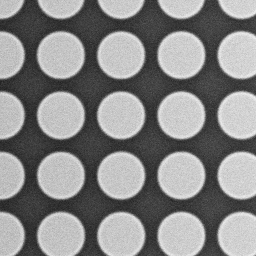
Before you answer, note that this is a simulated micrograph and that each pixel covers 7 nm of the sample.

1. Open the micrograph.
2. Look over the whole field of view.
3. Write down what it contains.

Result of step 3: an array of small figures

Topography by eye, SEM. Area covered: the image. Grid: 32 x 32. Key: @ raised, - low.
@@@--@@@@@--@@@@@@--@@@@@--@@@@@
@@----@@@@---@@@@----@@@@---@@@@
--------------------------------
--------------------------------
@@----@@@-----@@@----@@@-----@@@
@@@--@@@@@---@@@@@--@@@@@---@@@@
@@@--@@@@@--@@@@@@--@@@@@@-@@@@@
@@@--@@@@@--@@@@@@--@@@@@--@@@@@
@@@--@@@@@---@@@@@--@@@@@---@@@@
@-----@@@-----@@-----@@@-----@@@
--------------------------------
--------------------------------
@@---@@@@@---@@@@---@@@@@---@@@@
@@@--@@@@@--@@@@@@--@@@@@--@@@@@
@@@--@@@@@--@@@@@@--@@@@@@-@@@@@
@@@--@@@@@--@@@@@@--@@@@@--@@@@@
@@----@@@@---@@@@----@@@@---@@@@
--------------------------------
--------------------------------
@@----@@@-----@@@----@@@-----@@@
@@@--@@@@@---@@@@@--@@@@@---@@@@
@@@--@@@@@--@@@@@@--@@@@@@-@@@@@
@@@--@@@@@--@@@@@@--@@@@@@-@@@@@
@@@--@@@@@---@@@@@--@@@@@---@@@@
@@----@@@-----@@@----@@@-----@@@
--------------------------------
--------------------------------
@@---@@@@@---@@@@----@@@@---@@@@
@@@--@@@@@--@@@@@@--@@@@@--@@@@@
@@@--@@@@@--@@@@@@--@@@@@@-@@@@@
@@@--@@@@@--@@@@@@--@@@@@--@@@@@
@@----@@@@---@@@@----@@@@---@@@@